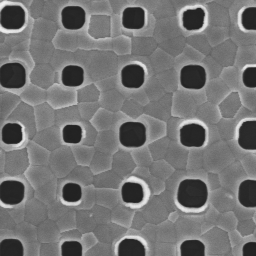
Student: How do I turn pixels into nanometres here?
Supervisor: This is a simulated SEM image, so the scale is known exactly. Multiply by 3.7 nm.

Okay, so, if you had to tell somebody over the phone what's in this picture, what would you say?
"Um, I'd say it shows a regular array of holes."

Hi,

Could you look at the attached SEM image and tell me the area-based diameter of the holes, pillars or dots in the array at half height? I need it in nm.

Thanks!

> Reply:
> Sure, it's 86.3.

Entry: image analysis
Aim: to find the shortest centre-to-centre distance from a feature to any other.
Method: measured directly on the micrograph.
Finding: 215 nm